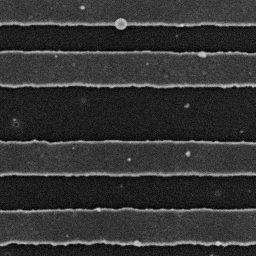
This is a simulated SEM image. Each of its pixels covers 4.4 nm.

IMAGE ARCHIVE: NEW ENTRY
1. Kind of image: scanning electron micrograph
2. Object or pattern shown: lines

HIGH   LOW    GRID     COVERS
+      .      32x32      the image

++++++++++++++++++++++++++++++++
++++++++++++++++++++++++++++++++
++++++++++++++++++++++++++++++++
...............+................
................................
................................
+++.+++..........++.............
++++++++++++++++++++++++++++++++
++++++++++++++++++++++++++++++++
++++++++++++++++++++++++++++++++
++++++++++++++++++++++++++++++++
................................
................................
................................
................................
................................
................................
................................
++++++++++++++++++++++++++++++++
++++++++++++++++++++++++++++++++
++++++++++++++++++++++++++++++++
++++++++++++++++++++++++++++++++
................................
................................
................................
................................
++++++++++++++++++++++++++++++++
++++++++++++++++++++++++++++++++
++++++++++++++++++++++++++++++++
++++++++++++++++++++++++++++++++
+.....++.......+++++++...++++++.
................................